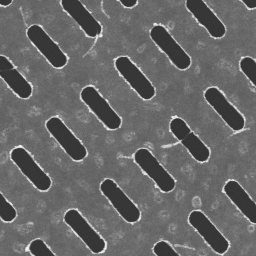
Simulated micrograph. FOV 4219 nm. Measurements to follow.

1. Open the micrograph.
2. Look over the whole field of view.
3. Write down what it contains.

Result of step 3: a regular array of holes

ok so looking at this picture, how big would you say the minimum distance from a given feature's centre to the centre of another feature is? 766 nanometers